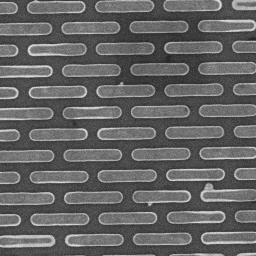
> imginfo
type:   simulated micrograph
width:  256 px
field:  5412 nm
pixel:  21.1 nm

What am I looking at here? groups of lines, slits or small figures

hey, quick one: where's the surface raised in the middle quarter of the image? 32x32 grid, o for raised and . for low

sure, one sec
ooooooooooooo....oooooooooooooo.
oooooooooooooo...oooooooooooooo.
oooooooooooooo...ooooooooooooo..
................................
................................
.........ooooooooooooo....oooooo
ooooo...ooooooooooooooo..ooooooo
ooooo...oooooooooooooo...ooooooo
................................
................................
............................oo..
oooooooooooooo...oooooooooooooo.
oooooooooooooo...oooooooooooooo.
ooooo...........................
................................
................................
ooooo....oooooooooooooo...oooooo
oooooo...oooooooooooooo..ooooooo
ooooo....ooooooooooooo....oooooo
................................
................................
.ooooooooooooo....ooooooooooooo.
oooooooooooooo...oooooooooooooo.
oooooooooooooo...oooooooooooooo.
................................
................................
.....................o.....ooooo
oooooo...oooooooooooooo...oooooo
oooooo...oooooooooooooo...oooooo
o.ooo.....oo....................
................................
................................